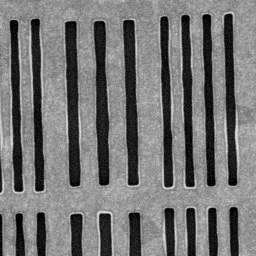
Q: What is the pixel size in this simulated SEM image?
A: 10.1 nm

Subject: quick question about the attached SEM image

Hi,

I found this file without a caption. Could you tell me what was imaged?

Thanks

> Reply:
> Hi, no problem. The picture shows groups of lines, slits or small figures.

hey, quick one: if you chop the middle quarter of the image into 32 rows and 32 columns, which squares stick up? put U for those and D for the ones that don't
DDDUUUUUDDDUUUUDDDUUUUUUDDDUUDDD
DDDUUUUUDDDUUUUDDDUUUUUUDDDUUDDD
DDDDUUUUDDDUUUUDDDUUUUUUDDDUUDDD
DDDDUUUUDDDUUUUDDDUUUUUUDDDUUDDD
DDDDUUUUDDDUUUUDDDUUUUUUDDDUUDDD
DDDDUUUUDDDUUUUDDDUUUUUUDDDUUUDD
DDDDUUUUDDDUUUUDDDUUUUUUDDDUUUDD
DDDDUUUUDDDUUUUDDDUUUUUUDDDUUUDD
UDDDUUUUDDDUUUUDDDUUUUUUDDDUUUDD
UDDDUUUUDDDUUUUDDDUUUUUUDDDUUUDD
UDDDUUUUDDDUUUUDDDUUUUUUDDDUUUDD
UDDDUUUUDDDUUUUDDDUUUUUUDDDUUUDD
UDDDUUUUDDDUUUUDDDDUUUUUDDDUUUDD
UDDDUUUUDDDUUUUDDDDUUUUUDDDUUUDD
UDDDUUUUDDDUUUUDDDDUUUUUUDDUUUDD
UDDDUUUUDDDUUUUDDDDUUUUUUDDUUUDD
UDDDUUUUDDDUUUUDDDDUUUUUUDDUUUDD
UDDDUUUUDDDUUUUDDDDUUUUUUDDUUUDD
UDDDUUUUDDDUUUUDDDDUUUUUUDDUUUDD
UDDDUUUUDDDUUUUDDDDUUUUUUDDUUUDD
UDDDUUUUDDDUUUUDDDDUUUUUUDDUUUDD
UDDDUUUUDDDUUUUUDDDUUUUUUDDUUUDD
UDDDUUUUDDDUUUUUDDDUUUUUUDDUUUDD
UDDDUUUUDDDUUUUUDDDUUUUUUDDUUUDD
UDDDUUUUDDDUUUUUDDDUUUUUUDDUUUDD
UDDDUUUUDDDUUUUUDDDUUUUUUDDUUUDD
UDDDUUUUDDDUUUUUDDDUUUUUUDDUUUDD
UDDDUUUUDDDUUUUUDDDUUUUUUDDUUUDD
UDDDUUUUDDDUUUUUDDDUUUUUUDDDUUDD
UDDDUUUUUDDUUUUUDDDUUUUUUDDUUUDD
UUDDUUUUUDDUUUUUDDUUUUUUUDDUUUDD
UUUUUUUUUUUUUUUUUUUUUUUUUUUUUUUU